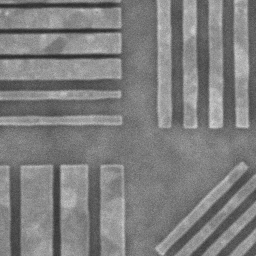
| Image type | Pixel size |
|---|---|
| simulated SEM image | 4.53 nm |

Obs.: groups of lines, slits or small figures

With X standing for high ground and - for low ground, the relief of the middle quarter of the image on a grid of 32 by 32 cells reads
XXXXXXXXXXXXXX----------XXX---XX
XXXXXXXXXXXXXX----------XXX---XX
XXXXXXXXXXXXXX----------XXX---XX
XXXXXXXXXX--XX----------XXX---XX
------------------------XXX---XX
------------------------XXX---XX
------------------------XXX---XX
XXXXXXXXXXXXXX----------XXX---XX
XXXXXXXXXX--------------XXX---XX
------------------------XXX---XX
------------------------XXX---XX
------------------------XXX---XX
------------------------XXX---XX
XXXXXXXXXXXXXX----------XXX---XX
XXXXXXXXXXXXXX----------XXX---XX
------------------------XX----XX
--------------------------------
--------------------------------
--------------------------------
--------------------------------
--------------------------------
--------------------------------
--------------------------------
--------------------------------
--------------------------------
-----------XXX------------------
XXXXXX---XXXXXX-----------------
XXXXXX---XXXXXX-----------------
XXXXXX---XXXXXX-----------------
XXXXXX---XXXXXX-----------------
XXXXXX---XXXXXX-----------------
XXXXXX---XXXXXX-----------------